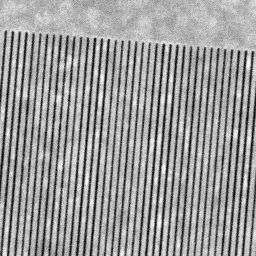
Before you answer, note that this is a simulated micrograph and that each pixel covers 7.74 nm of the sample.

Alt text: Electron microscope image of parallel lines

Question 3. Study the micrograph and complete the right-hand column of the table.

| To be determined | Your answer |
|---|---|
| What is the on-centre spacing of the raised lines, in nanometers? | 53.3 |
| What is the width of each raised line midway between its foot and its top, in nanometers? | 39.5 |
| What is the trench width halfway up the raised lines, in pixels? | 1.74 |